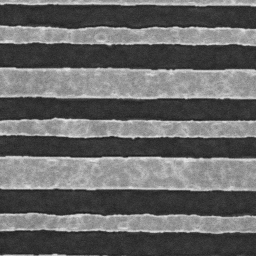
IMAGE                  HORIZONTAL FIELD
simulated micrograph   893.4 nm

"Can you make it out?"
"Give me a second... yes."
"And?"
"lines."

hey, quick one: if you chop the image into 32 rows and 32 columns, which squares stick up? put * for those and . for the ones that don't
...***...*....****..************
................................
................................
*******.....**.....*.****.......
********************************
...........*..***.*...**********
................................
................................
................................
********************************
********************************
********************************
................................
................................
................................
********************************
********************************
................................
................................
................................
********************************
********************************
********************************
*.****....**********************
................................
................................
................................
********************************
********************************
................................
................................
................................